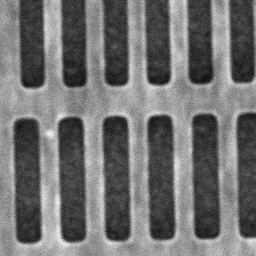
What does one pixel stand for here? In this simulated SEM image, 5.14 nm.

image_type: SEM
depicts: groups of lines, slits or small figures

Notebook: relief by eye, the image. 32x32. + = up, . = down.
++....+....++...++...++....++...
++....+....++...++...++....++...
++....++...++...++...++....++...
++....++...++...++...++....++...
++....++...++...++...++....++...
++....++...++...++...++....++...
++....++...++...++...++....++...
++....++...++...++....+....++...
++....++...++...++....+....++...
+++...++...++...++....++...++...
+++...++...++...+++..+++..++++.+
++++++++++++++++++++++++++++++++
++++++++++++++++++++++++++++++++
++++++++++++++++++++++++++++++++
++++++++++++++.++++..+++...+++..
++...++...+++...++....++...++...
++...++....++...++....++...++...
++...++....++...++....++...++...
++...++....++...++....++...+++..
++...++....++...++....++...+++..
++...++....++...++....++...+++..
++...++....++...++....++...+++..
++...++....++...++....++...+++..
++...++....++...+++...++...+++..
++...++....++...+++...++....++..
++...++....++...+++...++....++..
++...++....++...+++...++....++..
++...++....++...+++...++....++..
++...++....++...+++...++....++..
++...+++...++...+++...++...+++..
+++.++++++++++++++++++++++++++++
++++++++++++++++++++++++++++++++